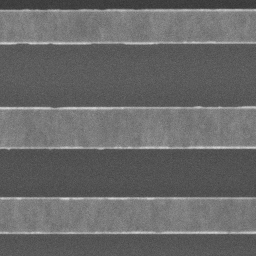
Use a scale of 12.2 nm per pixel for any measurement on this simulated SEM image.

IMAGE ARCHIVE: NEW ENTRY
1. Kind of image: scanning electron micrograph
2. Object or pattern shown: lines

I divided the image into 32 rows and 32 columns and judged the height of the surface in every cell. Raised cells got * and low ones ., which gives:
................................
********************************
********************************
********************************
********************************
................................
................................
................................
................................
................................
................................
................................
................................
********************************
********************************
********************************
********************************
********************************
********************************
................................
................................
................................
................................
................................
................................
********************************
********************************
********************************
********************************
................................
................................
................................